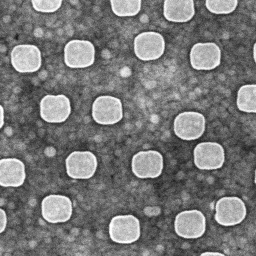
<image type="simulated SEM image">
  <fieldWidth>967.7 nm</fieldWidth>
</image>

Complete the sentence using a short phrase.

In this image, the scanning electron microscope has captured a regular array of raised bodies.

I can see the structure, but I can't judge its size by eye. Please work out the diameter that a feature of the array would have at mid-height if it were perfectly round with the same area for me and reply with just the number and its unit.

0.112 micrometres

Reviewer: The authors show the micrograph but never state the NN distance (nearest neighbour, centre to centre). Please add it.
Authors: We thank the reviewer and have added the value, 198 nm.